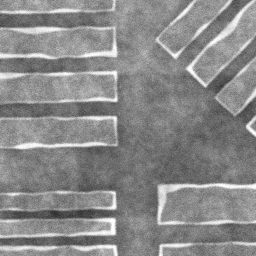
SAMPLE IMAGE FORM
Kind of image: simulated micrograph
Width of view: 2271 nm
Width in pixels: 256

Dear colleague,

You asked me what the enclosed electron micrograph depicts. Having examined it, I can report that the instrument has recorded groups of lines, slits or small figures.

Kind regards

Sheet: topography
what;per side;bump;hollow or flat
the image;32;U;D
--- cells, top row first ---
UUUUUUUUUUUUUUDDDDDDDDDDUUUUDDDU
UUUUUUUDDDDDDDDDDDDDDDDUUUUUDDUU
DDDDDDDDDDDDDDDDDDDDDDUUUUUDDDUU
DDDDDDDDDUUUDUDDDDDDDUUUUDDDDUUU
UUUUUUUUUUUUUUDDDDDDUUUUDDDDUUUU
UUUUUUUUUUUUUUDDDDDDUUUUDDUUUUUD
UUUUUUUUUUUUUUDDDDDDDUDDDUUUUUDD
DDDDDDDDDDDDDDDDDDDDDDDDUUUUUDDD
DDDDDDDDDDDDDDDDDDDDDDDDUUUUDDDU
UUUUUUUUUUUUUUDDDDDDDDDDUUUDDDUU
UUUUUUUUUUUUUUUDDDDDDDDDDUDDUUUU
UUUUUUUUUUUUUUUDDDDDDDDDDDDUUUUU
UUUUUUUUUUUDDDDDDDDDDDDDDDDUUUUD
DDDDDDDDDDDDDDDDDDDDDDDDDDDDUUDD
DDDDDDDDDDDDDDDDDDDDDDDDDDDDDDDD
UUUUUUUUUUUUUUDDDDDDDDDDDDDDDDDU
UUUUUUUUUUUUUUUDDDDDDDDDDDDDDDDD
UUUUUUUUUUUUUUUDDDDDDDDDDDDDDDDD
DDDDDDDDDDDDDDDDDDDDDDDDDDDDDDDD
DDDDDDDDDDDDDDDDDDDDDDDDDDDDDDDD
DDDDDDDDDDDDDDDDDDDDDDDDDDDDDDDD
DDDDDDDDDDDDDDDDDDDDDDDDDDDDDDDD
DDDDDDDDDDDDDDDDDDDDDDDDDDDDDDDD
DDDDDDDDDDDDDDDDDDDDDDUUUUUUUUUU
UUUUUUUUUUUUUUDDDDDDUUUUUUUUUUUU
UUUUUUUUUUUUUUDDDDDDUUUUUUUUUUUU
DDDDDDDDDDDDDDDDDDDDUUUUUUUUUUUU
DDDUUDDDUUUDDDDDDDDDUUUUUUUUUUUU
UUUUUUUUUUUUUUDDDDDDDDDDDDDDDDDD
UUDUUDDDDDDDDDDDDDDDDDDDDDDDDDDD
DDDDDDDDDDDDDDDDDDDDDDDDDDDDUUUD
UUUUUUUUUUUUUUUDDDDDUUUUUUUUUUUU